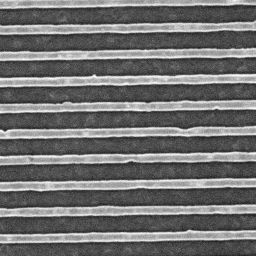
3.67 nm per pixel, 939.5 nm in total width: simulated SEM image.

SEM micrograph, parallel lines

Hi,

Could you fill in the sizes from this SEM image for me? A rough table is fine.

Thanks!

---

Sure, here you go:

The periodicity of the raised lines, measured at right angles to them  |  95.7 nm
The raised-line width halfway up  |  0.0289 microns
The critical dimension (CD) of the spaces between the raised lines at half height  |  68.8 nm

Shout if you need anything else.